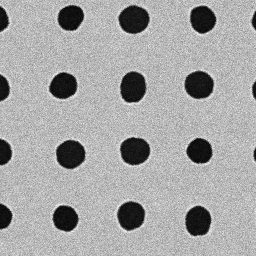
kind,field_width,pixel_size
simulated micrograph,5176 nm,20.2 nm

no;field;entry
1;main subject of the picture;a regular array of holes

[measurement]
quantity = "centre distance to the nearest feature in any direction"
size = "64.5 pixels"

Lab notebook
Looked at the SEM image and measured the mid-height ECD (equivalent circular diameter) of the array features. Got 584 nanometers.